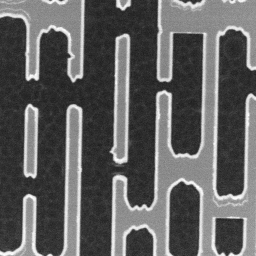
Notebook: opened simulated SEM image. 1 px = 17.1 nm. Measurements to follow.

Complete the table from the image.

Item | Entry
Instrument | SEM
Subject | parallel lines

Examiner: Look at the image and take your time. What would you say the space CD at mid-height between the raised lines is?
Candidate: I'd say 30.9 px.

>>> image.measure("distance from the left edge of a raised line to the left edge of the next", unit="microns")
0.759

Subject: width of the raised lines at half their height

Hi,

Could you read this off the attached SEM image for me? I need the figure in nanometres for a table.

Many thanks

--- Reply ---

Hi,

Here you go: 227